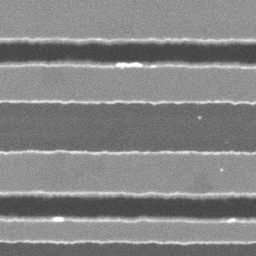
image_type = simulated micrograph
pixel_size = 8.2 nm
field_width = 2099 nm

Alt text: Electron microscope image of lines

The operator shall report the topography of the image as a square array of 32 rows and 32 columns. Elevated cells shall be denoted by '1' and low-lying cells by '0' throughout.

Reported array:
11111111111111111111111111111111
11111111111111111111111111111111
11111111111111111111111111111111
11111111111111111111111111111111
11111111111111111111111111111111
00000000000000000000000000000000
00000000000000000000000000000000
00000000000000000000000000000000
11111111111111111111111111111111
11111111111111111111111111111111
11111111111111111111111111111111
11111111111111111111111111111111
11111111111111111111111111111111
00000000000000000000000000000000
00000000000000000000000000000000
00000000000000000000000000000000
00000000000000000000000000000000
00000000000000000000000000000000
00000000000000000000000000000000
11111111111111111111111111111111
11111111111111111111111111111111
11111111111111111111111111111111
11111111111111111111111111111111
11111111111111111111111111111111
00000000000000000000000000000000
00000000000000000000000000000000
00000000000000000000000000000000
11111111111011100111000000001100
11111111111111111111111111111111
11111111111111111111111111111111
00000000000000000000000000000000
00000000000000000000000000000000